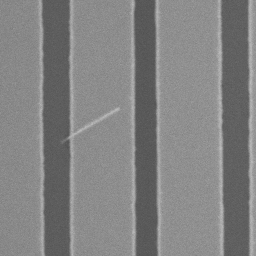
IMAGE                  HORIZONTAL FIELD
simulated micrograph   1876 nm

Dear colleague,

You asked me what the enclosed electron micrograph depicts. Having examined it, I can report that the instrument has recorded lines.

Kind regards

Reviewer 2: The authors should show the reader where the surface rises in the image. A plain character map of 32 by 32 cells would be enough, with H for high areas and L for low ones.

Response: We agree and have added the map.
HHHHHLLLLHHHHHHHHLLHHHHHHHHHLLLH
HHHHHLLLLHHHHHHHHLLHHHHHHHHHLLLH
HHHHHLLLLHHHHHHHHLLHHHHHHHHHLLLH
HHHHHLLLLHHHHHHHHLLLHHHHHHHHLLLH
HHHHHLLLLHHHHHHHHLLLHHHHHHHHLLLH
HHHHHLLLLHHHHHHHHLLLHHHHHHHHLLLH
HHHHHLLLLHHHHHHHHLLLHHHHHHHHLLLH
HHHHHLLLLHHHHHHHHLLLHHHHHHHHLLLH
HHHHHLLLLHHHHHHHHLLLHHHHHHHHLLLH
HHHHHLLLLHHHHHHHHLLLHHHHHHHHLLLH
HHHHHLLLLHHHHHHHHLLLHHHHHHHHLLLH
HHHHHLLLLHHHHHHHHLLLHHHHHHHHLLLH
HHHHHLLLLHHHHHHHHLLLHHHHHHHHLLLH
HHHHHLLLLHHHHHHHHLLLHHHHHHHHLLLH
HHHHHLLLLHHHHHHHHLLLHHHHHHHHLLLH
HHHHHLLLLHHHHHHHHLLLHHHHHHHHLLLH
HHHHHLLLLHHHHHHHHLLLHHHHHHHHLLLH
HHHHHLLLLHHHHHHHHLLLHHHHHHHHLLLH
HHHHHLLLLHHHHHHHHLLLHHHHHHHHLLLH
HHHHHLLLLHHHHHHHHLLLHHHHHHHHLLLH
HHHHHLLLLHHHHHHHHLLLHHHHHHHHLLLH
HHHHHLLLLHHHHHHHHLLLHHHHHHHHLLLH
HHHHHLLLLHHHHHHHHLLLHHHHHHHHLLLH
HHHHHLLLLHHHHHHHHLLLHHHHHHHHLLLH
HHHHHLLLLHHHHHHHHLLLHHHHHHHHLLLH
HHHHHLLLLHHHHHHHHLLLHHHHHHHHLLLH
HHHHHLLLLHHHHHHHHLLLHHHHHHHHLLLH
HHHHHLLLLHHHHHHHHLLLHHHHHHHHLLLH
HHHHHLLLLHHHHHHHHLLLHHHHHHHHLLLH
HHHHHLLLLHHHHHHHHLLLHHHHHHHHLLLH
HHHHHLLLLHHHHHHHHLLLHHHHHHHHLLLH
HHHHHHLLLHHHHHHHHLLLHHHHHHHHLLLH